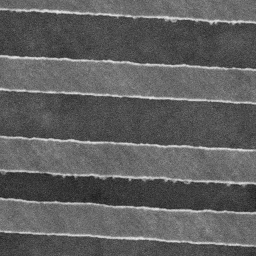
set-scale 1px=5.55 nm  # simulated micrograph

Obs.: lines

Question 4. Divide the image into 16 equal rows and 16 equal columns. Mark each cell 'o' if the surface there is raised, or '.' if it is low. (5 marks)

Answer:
oooooooooooooooo
................
................
o...............
oooooooooooooooo
oooooooooooooooo
................
................
................
oooooooooooooooo
oooooooooooooooo
................
o...............
oooooooooooooooo
oooooooooooooooo
................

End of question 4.